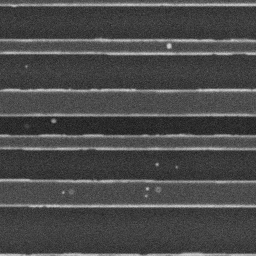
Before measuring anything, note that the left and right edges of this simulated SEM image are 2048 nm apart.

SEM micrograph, lines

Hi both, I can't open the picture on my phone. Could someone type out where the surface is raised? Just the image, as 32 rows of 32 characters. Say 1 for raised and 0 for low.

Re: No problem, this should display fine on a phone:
11111111111111111111111111111111
00000000000000000000000000000000
00000000000000000000000000000000
00000000000000000000000000000000
00000000000000000000000000000000
11111111111111111111111111111111
11111111111111111111111111111111
00000000000000000000000000000000
00000000000000000000000000000000
00000000000000000000000000000000
00000000000000000000000000000000
11111111111111111111111111111111
11111111111111111111111111111111
11111111111111111111111111111111
00000000000000000000000000000000
00000000000000000000000000000000
00000000000000000000000000000000
11111111111111111111111111111111
11111111111111111111111111111111
00000000000000000000000000000000
00000000000000000000000000000000
00000000000000000000000000000000
11110000000000000000000000000000
11111111111111111111111111111111
11111111111111111111111111111111
11111111111111111111111111111111
00000000000000000000000000000000
00000000000000000000000000000000
00000000000000000000000000000000
00000000000000000000000000000000
00000000000000000000000000000000
00000000000000000000000000000000